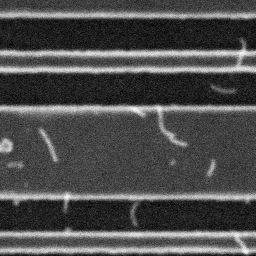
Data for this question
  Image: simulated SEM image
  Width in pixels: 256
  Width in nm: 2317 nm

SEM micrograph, lines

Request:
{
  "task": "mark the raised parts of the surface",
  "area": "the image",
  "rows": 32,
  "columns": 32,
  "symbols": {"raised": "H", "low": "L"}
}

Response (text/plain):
HHHHHHHHHHHHHHHHHHHHHHHHHHHHHHHH
HHHHHHHHHHHHHHHHHHHHHHHHHHHHHHHH
LLLLLLLLLLLLLLLLLLLLLLLLLLLLLLLL
LLLLLLLLLLLLLLLLLLLLLLLLLLLLLLLL
LLLLLLLLLLLLLLLLLLLLLLLLLLLLLLLL
LLLLLLLLLLLLLLLLLLLLLLLLLLLLLLLL
LLLLLLLLLLLLLLLLLLLLLLLLLLLLLLHL
HHHHHHHHHHHHHHHHHHHHHHHHHHHHHHHH
HHHHHHHHHHHHHHHHHHHHHHHHHHHHHHHH
LLLLLLLLLLLLLLLLLLLLLLLLLLLLLLLL
LLLLLLLLLLLLLLLLLLLLLLLLLLLLLLLL
LLLLLLLLLLLLLLLLLLLLLLLLLLLLLLLL
LLLLLLLLLLLLLLLLLLLLLLLLLLLLLLLL
HHHHHHHHHHHHHHHHHHHHHHHHHHHHHHHH
HHHHHHHHHHHHHHHHHHHHHHHHHHHHHHHH
HHHHHHHHHHHHHHHHHHHHHHHHHHHHHHHH
HHHHHHHHHHHHHHHHHHHHHHHHHHHHHHHH
HHHHHHHHHHHHHHHHHHHHHHHHHHHHHHHH
HHHHHHHHHHHHHHHHHHHHHHHHHHHHHHHH
HHHHHHHHHHHHHHHHHHHHHHHHHHHHHHHH
HHHHHHHHHHHHHHHHHHHHHHHHHHHHHHHH
HHHHHHHHHHHHHHHHHHHHHHHHHHHHHHHH
HHHHHHHHHHHHHHHHHHHHHHHHHHHHHHHH
HHHHHHHHHHHHHHHHHHHHHHHHHHHHHHHH
HHHHHHHHHHHHHHHHHHHHHHHHHHHHHHHH
LLLLLLLLLLLLLLLLLLLLLLLLLLLLLLLL
LLLLLLLLLLLLLLLLLLLLLLLLLLLLLLLL
LLLLLLLLLLLLLLLLLLLLLLLLLLLLLLLL
LLLLLLLLLLLLLLLLLLLLLLLLLLLLLLLL
HHHHHHHHHHHHHHHHHHHHHHHHHHHHHHHH
HHHHHHHHHHHHHHHHHHHHHHHHHHHHHHHH
HLLHHHLLLLLLLLHLLLLHHLLLLLLLLLHH